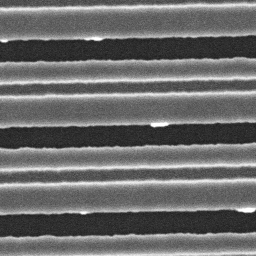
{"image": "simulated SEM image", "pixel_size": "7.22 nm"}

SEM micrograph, lines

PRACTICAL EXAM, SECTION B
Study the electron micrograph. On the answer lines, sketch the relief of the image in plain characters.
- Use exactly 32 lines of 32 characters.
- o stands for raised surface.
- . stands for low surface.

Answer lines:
oooooooooooooooooooooooooooooooo
oooooooooooooooooooooooooooooooo
oooooooooooooooooooooooooooooooo
oooooooooooooooooooooooooooooooo
oooooooooooooooooooooooooooo.o..
................................
................................
................o...oooooooooooo
oooooooooooooooooooooooooooooooo
oooooooooooooooooooooooooooooooo
oooooooooooooooooooooooooooooooo
oooooooooooooooooooooooooooooooo
oooooooooooooooooooooooooooooooo
oooooooooooooooooooooooooooooooo
oooooooooooooooooooooooooooooooo
oooooooooooooooo..ooo...........
................................
................................
...o......oooooooooooooooooooooo
oooooooooooooooooooooooooooooooo
oooooooooooooooooooooooooooooooo
oooooooooooooooooooooooooooooooo
oooooooooooooooooooooooooooooooo
oooooooooooooooooooooooooooooooo
oooooooooooooooooooooooooooooooo
oooooooooooooooooooooooooooooooo
oooooooooooo....................
................................
................................
..............oooooooooooooooooo
oooooooooooooooooooooooooooooooo
oooooooooooooooooooooooooooooooo